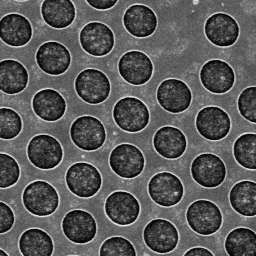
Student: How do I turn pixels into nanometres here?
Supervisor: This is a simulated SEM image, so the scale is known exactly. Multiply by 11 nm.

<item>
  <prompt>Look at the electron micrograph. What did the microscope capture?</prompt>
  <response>a regular array of holes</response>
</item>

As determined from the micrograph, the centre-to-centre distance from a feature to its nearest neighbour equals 513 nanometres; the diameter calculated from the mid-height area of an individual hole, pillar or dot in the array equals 380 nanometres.